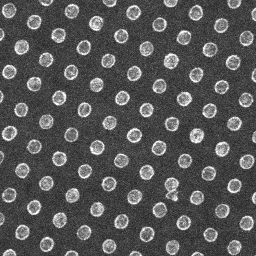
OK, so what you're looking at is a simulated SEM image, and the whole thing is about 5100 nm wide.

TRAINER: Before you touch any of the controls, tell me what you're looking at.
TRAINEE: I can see a regular array of raised bodies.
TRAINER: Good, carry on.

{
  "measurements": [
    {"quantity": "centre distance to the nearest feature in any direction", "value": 540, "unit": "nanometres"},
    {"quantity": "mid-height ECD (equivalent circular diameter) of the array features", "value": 267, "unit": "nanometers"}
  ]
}